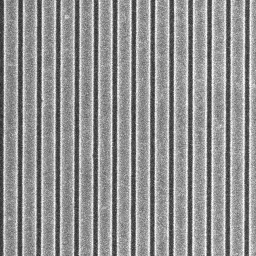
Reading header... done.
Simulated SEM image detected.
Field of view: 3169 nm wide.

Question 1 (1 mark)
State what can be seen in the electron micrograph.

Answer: parallel lines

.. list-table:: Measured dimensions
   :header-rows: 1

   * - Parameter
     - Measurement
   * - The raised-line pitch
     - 0.234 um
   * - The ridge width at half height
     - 166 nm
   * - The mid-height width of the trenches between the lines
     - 71.2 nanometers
